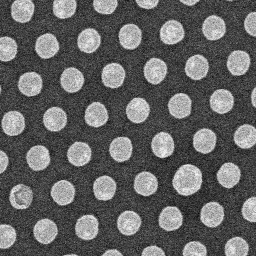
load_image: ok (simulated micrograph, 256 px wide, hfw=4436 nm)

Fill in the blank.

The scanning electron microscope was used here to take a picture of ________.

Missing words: a regular array of raised bodies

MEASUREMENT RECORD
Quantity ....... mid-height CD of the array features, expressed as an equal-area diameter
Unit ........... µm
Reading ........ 0.416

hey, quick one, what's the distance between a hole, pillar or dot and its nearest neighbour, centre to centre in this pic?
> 41.7 px